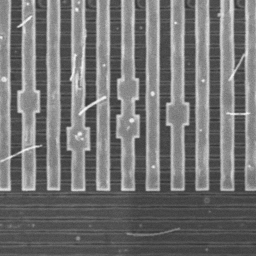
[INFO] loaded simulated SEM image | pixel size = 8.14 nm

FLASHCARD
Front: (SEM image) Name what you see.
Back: wiring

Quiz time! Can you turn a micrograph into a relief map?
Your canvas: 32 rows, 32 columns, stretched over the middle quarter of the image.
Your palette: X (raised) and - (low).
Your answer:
--XXX---XXX---XXX----XXX---XXX--
--XXX---XXX---XXX----XXX---XXX--
--XXX---XXX---XXX----XXX---XXX--
--XXX---XXX---XXXX---XXX---XXX--
--XXX---XXX---XXXX---XX----XXX--
--XXX---XXX---XXXX---XX----XXX--
--XXX---XXX---XXXX---XX----XXX--
--XXX---XXX---XXXX---XXX---XXX--
--XXX---XXX---XXXX---XXX---XXX--
--XXX--XXXX---XXXX---XXX---XXX--
--XXX-X-XXX---XXX----XXX--XXXXX-
--XXX---XXX---XXX----XXX--XXXXX-
--XXX---XXX---XXXX---XXX--XXXXX-
--XXX---XXX--XXXXXX--XXX--XXXXX-
--XXX---XXX--XXXXXX--XXX--XXXXX-
--XXX---XXX--XXXXXX--XXX---XXX--
-XXXXX--XXX--XXXXXX--XXX---XXX--
-XXXXX--XXX--XXXXXX--XXX---XXX--
-XXXXX--XXX---XXXX---XX----XXX--
-XXXXX--XXX---XXX----XX----XXX--
-XXXXX--XXX---XXX----XX----XXX--
--XXX---XXX----XX----XX----XXX--
--XXX---XXX----XX----XX----XXX--
--XXX---XXX---XXX----XXX---XXX--
--XXX---XXX---XXX----XXX---XXX--
--XXX---XXX---XXX----XXX---XXX--
--XXX---XXX----XX----XXX---XXX--
--XXX---XXX----XX----XXX---XXX--
--XXX---XXX----XX----XXX---XXX--
--XXX---XXX----XX----XXX---XXX--
--XXX---XXX----XXX---XXX---XXX--
--XXX-----------X----XXX--------